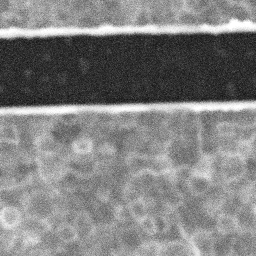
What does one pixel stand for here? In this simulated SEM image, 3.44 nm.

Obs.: one or a few lines or trenches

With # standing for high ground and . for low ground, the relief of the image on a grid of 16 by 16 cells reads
################
################
................
................
................
................
................
################
################
################
################
################
################
################
################
################